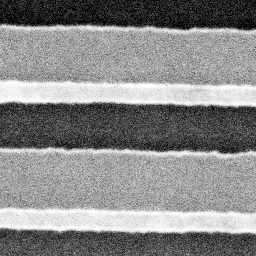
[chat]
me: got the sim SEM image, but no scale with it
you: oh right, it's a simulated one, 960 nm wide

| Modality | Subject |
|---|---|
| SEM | lines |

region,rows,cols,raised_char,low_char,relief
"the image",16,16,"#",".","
................
................
################
################
################
################
...........#..##
................
................
########........
################
################
################
################
..............#.
................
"